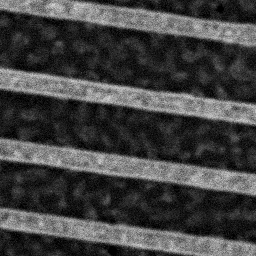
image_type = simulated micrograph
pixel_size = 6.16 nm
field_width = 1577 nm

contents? one or a few lines or trenches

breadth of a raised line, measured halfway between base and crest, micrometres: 0.105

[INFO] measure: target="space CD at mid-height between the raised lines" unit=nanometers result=322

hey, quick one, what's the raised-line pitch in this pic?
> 441 nanometres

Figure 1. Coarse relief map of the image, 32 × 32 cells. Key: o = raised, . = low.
ooooooooooo.....................
...oooooooooooooooo.............
..........ooooooooooooooo.......
.................ooooooooooooooo
........................oooooooo
...............................o
................................
................................
................................
ooooo...........................
oooooooooooo....................
....oooooooooooooo..............
...........ooooooooooooooo......
..................oooooooooooooo
..........................oooooo
................................
................................
................................
oooooooo........................
oooooooooooooo..................
......ooooooooooooooo...........
.............ooooooooooooooo....
.....................ooooooooooo
...........................ooooo
................................
................................
oo..............................
ooooooooo.......................
.ooooooooooooooo................
........ooooooooooooooo.........
...............ooooooooooooooo..
......................oooooooooo